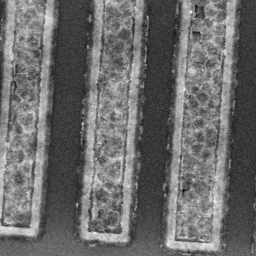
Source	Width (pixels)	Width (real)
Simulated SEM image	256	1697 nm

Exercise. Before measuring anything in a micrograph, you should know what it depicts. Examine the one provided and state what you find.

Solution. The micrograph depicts one or a few lines or trenches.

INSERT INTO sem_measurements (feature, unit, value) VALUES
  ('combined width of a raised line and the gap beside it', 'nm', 590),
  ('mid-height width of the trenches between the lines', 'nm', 316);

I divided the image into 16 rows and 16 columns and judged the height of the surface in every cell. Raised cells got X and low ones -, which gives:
-XX---XXX---XX--
-XX---XXX---XX--
-XX---XXX--XXX--
XXX---XXX--XXX--
XXX---XX---XXX--
XXX---XX---XXX--
XXX---XX---XXX--
XXX---XX---XXX--
XXX---XX---XXX--
XXX---XX---XXX--
XX----XX---XXX--
XX---XXX---XXX--
XX---XXX---XXX--
XX---XXX---XXX--
-----XXX---XXX--
----------------